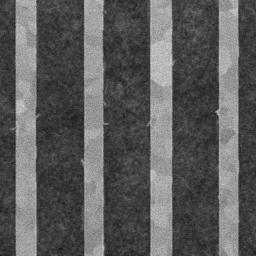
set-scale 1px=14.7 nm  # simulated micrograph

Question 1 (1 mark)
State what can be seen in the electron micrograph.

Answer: one or a few lines or trenches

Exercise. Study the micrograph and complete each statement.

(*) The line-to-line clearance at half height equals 716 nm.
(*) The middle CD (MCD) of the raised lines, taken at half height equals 282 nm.